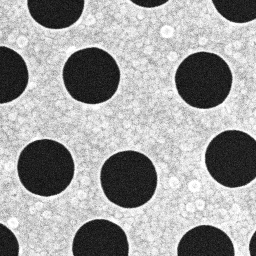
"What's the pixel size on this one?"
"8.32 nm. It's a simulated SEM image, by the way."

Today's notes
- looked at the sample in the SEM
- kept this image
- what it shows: holes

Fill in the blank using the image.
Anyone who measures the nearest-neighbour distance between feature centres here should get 0.778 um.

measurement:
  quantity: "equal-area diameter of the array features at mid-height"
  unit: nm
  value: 479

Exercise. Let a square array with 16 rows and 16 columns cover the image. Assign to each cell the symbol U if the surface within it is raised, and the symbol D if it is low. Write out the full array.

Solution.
UUDDDUUUUUUUUDDD
UUDDDUUUUUUUUUUU
UUUUUUUUUUUUUUUU
DUUUDDDUUUUUDDUU
DDUUDDDDUUUDDDUU
DDUUDDDUUUUDDDUU
UUUUUUUUUUUUDDUU
UUUUUUUUUUUUUUUU
UUUUUUUUUUUUUUDD
UDDDUUUDDUUUUDDD
UDDDDUDDDDUUUDDD
UDDDUUDDDDUUUUDU
UUUUUUUDDUUUUUUU
UUUUUUUUUUUUUUUU
DUUUUDDDUUUUDDUU
DUUUUDDDUUUDDDDU